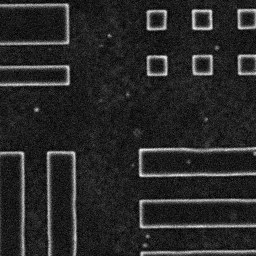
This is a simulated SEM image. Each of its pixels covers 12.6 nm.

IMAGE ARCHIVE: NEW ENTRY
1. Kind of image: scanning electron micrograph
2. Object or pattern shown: groups of lines, slits or small figures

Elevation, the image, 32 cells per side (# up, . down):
................................
########...........#....##....##
########...........##...##....##
########...........#....##....##
########........................
####............................
................................
...................##...##....##
########...........##...##....##
#########.......................
########........................
................................
................................
................................
................................
................................
................................
................................
................................
###...###........###############
###...###........###############
###...###........###############
###...###.......................
###...###.......................
###...###.......................
###...###.........##############
###...###.........##############
###...###.........##############
###...###.......................
###...###.......................
###...###.......................
###...###...............########